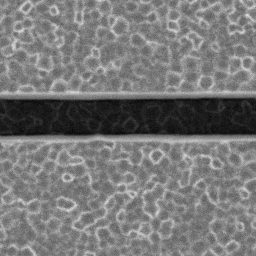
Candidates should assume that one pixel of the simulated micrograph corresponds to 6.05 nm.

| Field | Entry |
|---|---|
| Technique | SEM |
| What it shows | one or a few lines or trenches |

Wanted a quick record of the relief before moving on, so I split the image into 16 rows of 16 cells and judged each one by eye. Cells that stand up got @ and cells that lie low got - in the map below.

@@@@@@@@@@@@@@@@
@@@@@@@@@@@@@@@@
@@@@@@@@@@@@@@@@
@@@@@@@@@@@@@@@@
@@@@@@@@@@@@@@@@
@@@@@@@@@@@@@@@@
----------------
----------------
----------------
@@@@@@@@@@@@@@@@
@@@@@@@@@@@@@@@@
@@@@@@@@@@@@@@@@
@@@@@@@@@@@@@@@@
@@@@@@@@@@@@@@@@
@@@@@@@@@@@@@@@@
@@@@@@@@@@@@@@@@